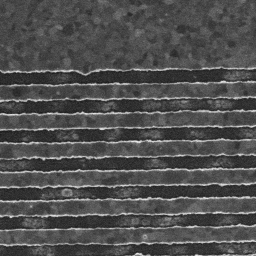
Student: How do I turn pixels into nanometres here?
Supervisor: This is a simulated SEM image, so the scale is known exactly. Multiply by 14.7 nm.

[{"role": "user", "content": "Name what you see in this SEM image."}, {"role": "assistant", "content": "parallel lines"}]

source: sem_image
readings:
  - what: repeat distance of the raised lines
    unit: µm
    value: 0.425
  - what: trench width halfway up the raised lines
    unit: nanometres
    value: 186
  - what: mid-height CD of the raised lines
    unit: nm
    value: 232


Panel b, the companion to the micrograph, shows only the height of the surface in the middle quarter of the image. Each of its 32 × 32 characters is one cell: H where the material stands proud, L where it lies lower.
HHHHHHHHHHHHHHHHHHHHHHHHHHHHHHHH
HHHHHHHHHHHLHHHHLLLHHHHHHLLLLLLL
LLLLHHLLLLLLLLLLLLLLLLLLLLLLLLLL
LLLLLLLLLLLLLLLLLLLLLLLLLLLLLLLL
LLLLLLLLLLLLLLLLLLLLLLLLLLLLLLLL
HHHHHHHHHHHHHHHHHHHHHHHHHHHHHHHH
HHHHHHHHHHHHHHHHHHHHHHHHHHHHHHHH
HHHHHHHHHHHHHHHHHHHHHHHHHHHHHHHH
HHHHHHHHHHHHHHHHHHHHHHHHHHHHHLHH
LLLLLLLLLLLLLLLLLLLLLLLLLLLLLLLL
LLLLLLLLLLLLLLLLLLLLLLLLLLLLLLLL
LLLLLLLLLLLLLLLLLLLLLLLLLLLLLLLL
LLLHHHLHHHHHHHHHHHHHHHHHHHHHHHHH
HHHHHHHHHHHHHHHHHHHHHHHHHHHHHHHH
HHHHHHHHHHHHHHHHHHHHHHHHHHHHHHHH
HHHHHHHHHHHHHHHHHHHHHHHHHHHHHHHH
LLLLLLLLLLLLLLLLLLLLLLLLLLLLLLLL
LLLLLLLLLLLLLLLLLLLLLLLLLLLLLLLL
LLLLLLLLLLLLLLLLLLLLLLLLLLLLLLLL
LHLLLLLLHHLLLHHHHHHHHHHHHHHHHHHH
HHHHHHHHHHHHHHHHHHHHHHHHHHHHHHHH
HHHHHHHHHHHHHHHHHHHHHHHHHHHHHHHH
HHHHHHHHHHHHHHHHHHHHHHHHHHHHHHHH
LLLLLLHHHLLLLLLLLLLLLLLLLLLLLLLL
LLLLLLLLLLLLLLLLLLLLLLLLLLLLLLLL
LLLLLLLLLLLLLLLLLLLLLLLLLLLLLLLL
LLLLLLLLLLLLLLLLLLLLLHHHLHHHHHHL
HHHHHHHHHHHHHHHHHHHHHHHHHHHHHHHH
HHHHHHHHHHHHHHHHHHHHHHHHHHHHHHHH
HHHHHHHHHHHHHHHHHHHHHHHHHHHHHHHH
LHHHHHHHHHHHHLLLLLLLLHLLLLLLLLLL
HLLLLLLLLLLLLLLLLLLLLLLLLLLLLLLL